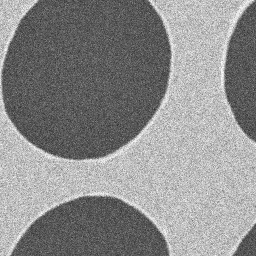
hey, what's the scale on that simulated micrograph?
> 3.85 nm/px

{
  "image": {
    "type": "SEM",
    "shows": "holes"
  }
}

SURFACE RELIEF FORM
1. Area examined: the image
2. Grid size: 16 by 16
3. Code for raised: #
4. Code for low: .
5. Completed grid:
##........#####.
#.........#####.
#..........###..
...........###..
...........###..
..........####..
..........####..
#.........#####.
#........######.
###....#########
################
################
####....########
##.......#######
##........######
#..........####.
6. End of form